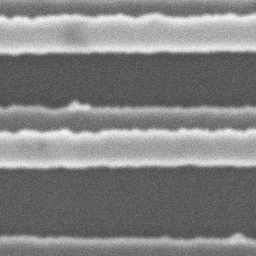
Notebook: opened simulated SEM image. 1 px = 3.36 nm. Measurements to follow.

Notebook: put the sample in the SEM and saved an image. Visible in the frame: lines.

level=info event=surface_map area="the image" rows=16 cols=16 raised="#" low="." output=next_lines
################
################
################
................
................
................
................
################
################
################
................
................
................
................
................
################